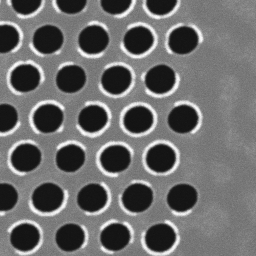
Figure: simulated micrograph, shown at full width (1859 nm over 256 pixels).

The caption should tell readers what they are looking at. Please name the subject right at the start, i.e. a regular array of holes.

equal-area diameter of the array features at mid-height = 216 nm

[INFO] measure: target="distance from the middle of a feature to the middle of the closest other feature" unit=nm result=324